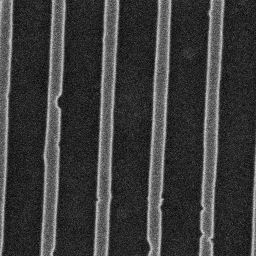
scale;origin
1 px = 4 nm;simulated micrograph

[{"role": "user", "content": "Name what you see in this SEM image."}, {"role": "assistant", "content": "parallel lines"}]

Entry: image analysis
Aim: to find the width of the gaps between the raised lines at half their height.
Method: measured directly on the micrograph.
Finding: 39.1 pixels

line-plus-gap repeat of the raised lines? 211 nanometers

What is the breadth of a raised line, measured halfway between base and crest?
52 nm